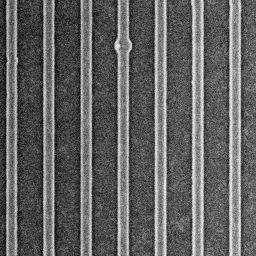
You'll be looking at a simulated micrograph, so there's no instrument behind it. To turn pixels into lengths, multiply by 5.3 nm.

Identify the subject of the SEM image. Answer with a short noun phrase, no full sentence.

parallel lines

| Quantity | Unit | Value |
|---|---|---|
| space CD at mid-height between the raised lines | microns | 0.144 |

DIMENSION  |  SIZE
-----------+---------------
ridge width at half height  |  51.7 nm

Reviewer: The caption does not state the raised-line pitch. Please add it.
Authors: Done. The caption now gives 0.198 µm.